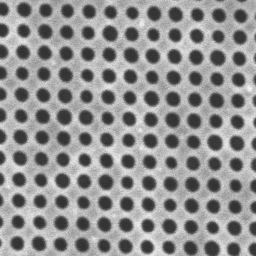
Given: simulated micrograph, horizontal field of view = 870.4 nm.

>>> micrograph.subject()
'a regular array of holes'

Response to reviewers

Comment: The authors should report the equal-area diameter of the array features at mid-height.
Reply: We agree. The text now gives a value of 48.8 nm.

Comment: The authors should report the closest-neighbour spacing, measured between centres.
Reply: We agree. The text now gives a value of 21.1 pixels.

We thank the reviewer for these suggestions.